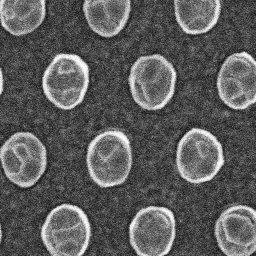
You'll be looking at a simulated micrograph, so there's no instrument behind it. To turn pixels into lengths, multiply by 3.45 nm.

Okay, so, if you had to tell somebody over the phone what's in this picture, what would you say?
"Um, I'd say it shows raised bodies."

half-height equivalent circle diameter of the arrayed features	172	nm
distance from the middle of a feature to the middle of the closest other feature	297	nm